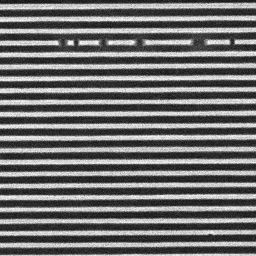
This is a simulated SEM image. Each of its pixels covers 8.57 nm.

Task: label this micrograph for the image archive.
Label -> parallel lines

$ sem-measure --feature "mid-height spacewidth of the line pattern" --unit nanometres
63.2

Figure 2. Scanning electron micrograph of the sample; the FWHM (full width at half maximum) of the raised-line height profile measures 39.7 nm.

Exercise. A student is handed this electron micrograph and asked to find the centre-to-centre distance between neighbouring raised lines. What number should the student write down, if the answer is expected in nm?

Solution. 102